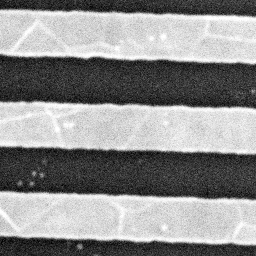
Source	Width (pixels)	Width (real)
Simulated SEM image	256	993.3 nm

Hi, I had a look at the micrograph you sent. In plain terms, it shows lines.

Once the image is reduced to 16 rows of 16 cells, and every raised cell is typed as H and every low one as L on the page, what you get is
LLLLLLLLLLLLLLLL
HHHHHHHHHHHHHHHH
HHHHHHHHHHHHHHHH
LLLLHHHHHHHHHHHH
LLLLLLLLLLLLLLLL
LLLLLLLLLLLLLLLL
HHHHLLLLLLLLLLLL
HHHHHHHHHHHHHHHH
HHHHHHHHHHHHHHHH
LLLLLLLLLLLLLLHH
LLLLLLLLLLLLLLLL
LLLLLLLLLLLLLLLL
HHHHHHHHHHHHHLLL
HHHHHHHHHHHHHHHH
HHHHHHHHHHHHHHHH
LLLLLLLLLLLLLLLL